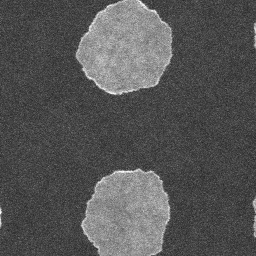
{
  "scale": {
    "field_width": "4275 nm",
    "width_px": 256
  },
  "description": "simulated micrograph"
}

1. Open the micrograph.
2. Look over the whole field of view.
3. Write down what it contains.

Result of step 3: raised bodies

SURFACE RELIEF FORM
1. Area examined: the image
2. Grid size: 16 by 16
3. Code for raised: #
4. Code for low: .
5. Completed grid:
.......##.......
......####......
.....######.....
.....######.....
.....#####......
......###.......
................
................
................
................
................
......####......
......####......
.....######.....
.....#####......
......####......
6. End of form